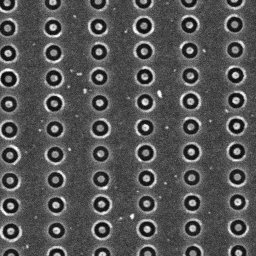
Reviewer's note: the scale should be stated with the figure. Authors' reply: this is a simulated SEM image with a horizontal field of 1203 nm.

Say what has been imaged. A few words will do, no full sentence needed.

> a regular array of ring-shaped grooves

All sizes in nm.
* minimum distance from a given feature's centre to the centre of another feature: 118